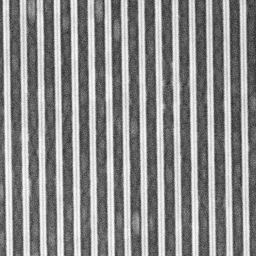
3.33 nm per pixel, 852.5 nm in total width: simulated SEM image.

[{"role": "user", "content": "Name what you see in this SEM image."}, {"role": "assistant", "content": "parallel lines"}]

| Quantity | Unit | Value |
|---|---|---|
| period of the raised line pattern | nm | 56.4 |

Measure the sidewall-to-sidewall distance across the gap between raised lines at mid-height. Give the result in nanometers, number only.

42.5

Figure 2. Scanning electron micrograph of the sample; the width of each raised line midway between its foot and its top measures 13.3 nm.